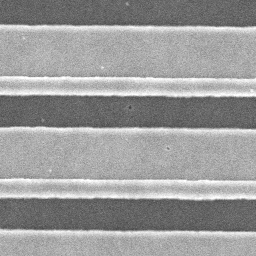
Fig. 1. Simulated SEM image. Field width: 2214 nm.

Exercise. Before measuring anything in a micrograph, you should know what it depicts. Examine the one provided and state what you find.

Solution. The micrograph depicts lines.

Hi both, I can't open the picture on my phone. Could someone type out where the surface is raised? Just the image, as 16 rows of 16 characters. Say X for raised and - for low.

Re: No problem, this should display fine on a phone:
----------------
----------------
XXXXXXXXXXXXXXXX
XXXXXXXXXXXXXXXX
XXXXXXXXXXXXXXXX
XXXXXXXXXXXXXXXX
----------------
----------------
XXXXXXXXXXXXXXXX
XXXXXXXXXXXXXXXX
XXXXXXXXXXXXXXXX
XXXXXXXXXXXXXXXX
----------------
----------------
XXXXXXX---------
XXXXXXXXXXXXXXXX